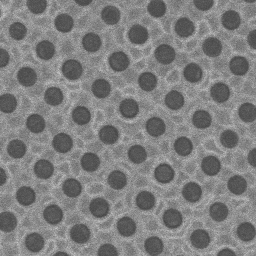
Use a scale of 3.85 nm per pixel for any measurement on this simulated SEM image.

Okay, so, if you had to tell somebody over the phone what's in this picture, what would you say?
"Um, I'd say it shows a regular array of holes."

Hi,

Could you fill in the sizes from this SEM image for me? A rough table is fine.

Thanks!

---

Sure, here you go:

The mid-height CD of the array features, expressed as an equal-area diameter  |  78.1 nm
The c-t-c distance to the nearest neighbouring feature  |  125 nm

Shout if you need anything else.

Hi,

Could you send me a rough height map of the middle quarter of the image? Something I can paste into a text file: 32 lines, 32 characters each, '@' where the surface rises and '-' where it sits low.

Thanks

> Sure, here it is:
-----@@@@@@-----@@@@@@@@@@@@@@--
-----@@@@@@@---@@@@@@@@@@@@@@@--
----@@@@@@@@@@@@@@@---@@@@@@@@--
----@@@@@@@@@@@@@@-----@@@@@@@--
@@@@@@@----@@@@@@@-----@@@@@@@@-
@@@@@@@-----@@@@@@@----@@@@@@@@@
@@@@@@@-----@@@@@@@----@@@@-@@@@
@@@@@@@----@@@@@@@@@@@@@@@----@@
@@@@@@@@--@@@@@@@@@@@@@@@-----@@
@@@@@@@@@@@@@@----@@@@@@@-----@@
@@@--@@@@@@@@@-----@@@@@@-----@@
@@----@@@@@@@@-----@@@@@@@@-@@@@
@@-----@@@@@@@----@@@@@@@@@@@@@@
@@-----@@@@@@@@@-@@@@@--@@@@@@@@
@@@---@@@@@@@@@@@@@@-----@@@@@@@
@@@@@@@@@@--@@@@@@@@------@@@@@@
@@@@@@@@@----@@@@@@@-----@@@@@@@
-@@@@@@@@-----@@@@@@@----@@@@@@@
--@@@@@@@-----@@@@@@@@@@@@@@---@
--@@@@@@@----@@@@@@@@@@@@@@-----
--@@@@@@@@@@@@@@@---@@@@@@@-----
--@@@@@@@@@@@@@@-----@@@@@@@----
@@@@@---@@@@@@@@-----@@@@@@@----
@@@@-----@@@@@@@-----@@@@@@@@@@@
@@@@-----@@@@@@@@---@@@@@@@@@@@@
@@@@-----@@@@@@@@@@@@@@----@@@@@
@@@@@---@@@@--@@@@@@@@@----@@@@@
@@@@@@@@@@@----@@@@@@@------@@@@
@-@@@@@@@@@-----@@@@@@@----@@@@@
----@@@@@@@-----@@@@@@@@--@@@@@-
----@@@@@@@----@@@@@@@@@@@@@@@--
-----@@@@@@@@-@@@@@@@@@@@@@@@---